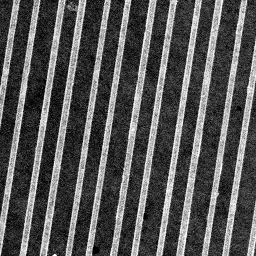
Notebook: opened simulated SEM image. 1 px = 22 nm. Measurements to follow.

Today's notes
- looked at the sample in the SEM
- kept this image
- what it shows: parallel lines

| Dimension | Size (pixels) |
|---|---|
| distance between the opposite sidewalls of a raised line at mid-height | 5.19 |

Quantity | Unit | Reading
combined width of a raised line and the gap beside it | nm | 494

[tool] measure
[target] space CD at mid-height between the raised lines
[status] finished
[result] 0.34 µm